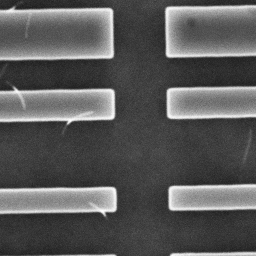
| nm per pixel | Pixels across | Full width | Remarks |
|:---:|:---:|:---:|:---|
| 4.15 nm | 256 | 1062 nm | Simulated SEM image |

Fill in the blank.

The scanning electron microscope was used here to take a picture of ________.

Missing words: groups of lines, slits or small figures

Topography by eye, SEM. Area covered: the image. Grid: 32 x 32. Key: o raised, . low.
................................
oooooooooooooo.......ooooooooooo
oooooooooooooo.......ooooooooooo
oooooooooooooo.......ooooooooooo
oooooooooooooo.......ooooooooooo
oooooooooooooo.......ooooooooooo
oooooooooooooo.......ooooooooooo
................................
................................
................................
................................
.ooooooooooooo.......ooooooooooo
oooooooooooooo.......ooooooooooo
oooooooooooooo.......ooooooooooo
oooooooooooooo.......oooooooooo.
................................
................................
................................
................................
................................
................................
................................
................................
............oo.......ooooooooooo
oooooooooooooo.......ooooooooooo
oooooooooooooo.......ooooooooooo
oooooo..........................
................................
................................
................................
................................
................................